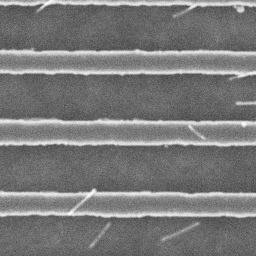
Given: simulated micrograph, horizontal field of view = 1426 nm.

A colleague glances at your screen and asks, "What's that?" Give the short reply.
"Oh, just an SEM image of lines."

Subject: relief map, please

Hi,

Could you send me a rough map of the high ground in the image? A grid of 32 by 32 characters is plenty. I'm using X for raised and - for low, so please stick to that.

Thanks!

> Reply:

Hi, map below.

XXXXXX---XX-XXXXXXXXXX-XXXXXXXXX
--------------------------------
--------------------------------
--------------------------------
--------------------------------
--------------------------------
XXXX-XXX-XXX-XXXXX---X-XXXXX----
XXXXXXXXXXXXXXXXXXXXXXXXXXXXXXXX
XXXXXXXXXXXXXXXXXXXXXXXXXXXXXXXX
--------------------------------
--------------------------------
--------------------------------
--------------------------------
--------------------------------
--------------------------------
XXXXXXXXXXXXXXXXXXXXXXXXXXXXXXXX
XXXXXXXXXXXXXXXXXXXXXXXXXXXXXXXX
XXXXXXXXXXXXXXXXXXXXXXXXXXXXXXXX
--------------------------------
--------------------------------
--------------------------------
--------------------------------
--------------------------------
--------------------------------
XXXXXXXXXXXXXXXXXXXXXXXXXXXXXXXX
XXXXXXXXXXXXXXXXXXXXXXXXXXXXXXXX
XXXXXXXXXXXXXXXXXXXXXXXXXXXXXXXX
--------------------------------
--------------------------------
--------------------------------
--------------------------------
--------------------------------